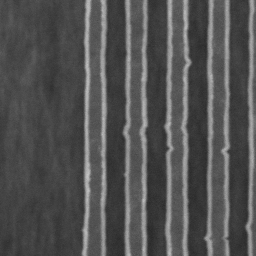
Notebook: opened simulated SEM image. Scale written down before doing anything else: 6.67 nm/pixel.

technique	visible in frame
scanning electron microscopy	parallel lines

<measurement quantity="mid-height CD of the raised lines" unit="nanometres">114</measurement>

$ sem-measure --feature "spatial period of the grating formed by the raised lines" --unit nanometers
274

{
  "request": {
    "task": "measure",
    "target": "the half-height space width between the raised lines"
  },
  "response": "159 nm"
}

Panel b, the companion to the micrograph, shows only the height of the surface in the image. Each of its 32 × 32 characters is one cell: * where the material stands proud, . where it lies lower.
...........**...**...**...**...*
...........**...**...**...**...*
...........**...**...**...**...*
...........**...**...**...**...*
...........**...**...**...**...*
...........**...**...**...**...*
...........**...**...**...**...*
...........**...**...**...**....
...........**...**...**...**....
...........**...**...**...**...*
...........**...**...**...**...*
...........**...**...**...**...*
...........**...**...**...**...*
...........**...**...**...**...*
...........**...**...**...**...*
...........**...**...**...**...*
...........**...**...**...**...*
...........**...**...**...**...*
...........**...**...**...**...*
...........**...**...**...**...*
...........**...**...**...**...*
...........**...**...**...**...*
...........**...**...**...**...*
...........**...**...**...**...*
...........**...**...**...**...*
...........**...**...**...**...*
...........**...**...**...**...*
...........**...**...**...**...*
...........**...**...**...**...*
...........**...**...**...**...*
...........**...**...**...**...*
...........**...**...**...**...*